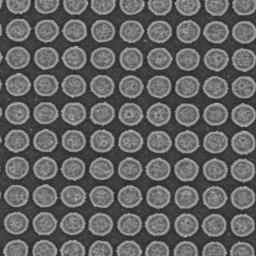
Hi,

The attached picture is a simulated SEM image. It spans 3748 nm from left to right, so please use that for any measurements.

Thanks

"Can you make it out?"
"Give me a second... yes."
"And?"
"a regular array of raised bodies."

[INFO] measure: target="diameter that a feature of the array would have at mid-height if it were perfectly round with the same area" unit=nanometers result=316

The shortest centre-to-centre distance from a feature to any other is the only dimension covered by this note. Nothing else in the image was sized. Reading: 401 nm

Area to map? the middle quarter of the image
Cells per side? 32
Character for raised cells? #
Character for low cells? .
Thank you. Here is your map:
.###....####...####...####...###
................................
................................
.###....###....###....###.....##
#####..#####..#####..#####...###
#####..#####..#####..#####..####
#####..#####..#####..#####..####
.###....###....####...####...###
................................
................................
####....###....###....###....###
#####..#####..#####..#####..####
#####..#####..#####..#####..####
#####..#####..#####..#####..####
.###....###....###....###....###
................................
................................
####...#####...###....###....###
#####..#####..#####..#####..####
#####..#####..#####..######.####
#####..#####..#####..#####..####
.##.....###....###....####...###
................................
................................
####...####....###....###....###
#####..#####..#####..#####..####
#####..#####..#####..#####..####
#####..#####..#####..#####..####
.###....##.....###....###....###
................................
................................
####...####....####..#####...###